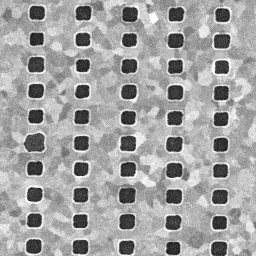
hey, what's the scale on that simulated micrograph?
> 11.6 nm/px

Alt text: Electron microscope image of a regular array of holes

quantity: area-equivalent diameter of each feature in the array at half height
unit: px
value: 17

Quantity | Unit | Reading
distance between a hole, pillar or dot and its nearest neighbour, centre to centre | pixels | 25.9